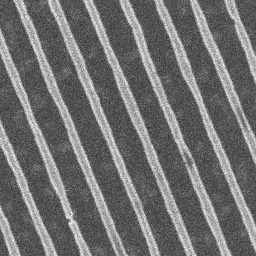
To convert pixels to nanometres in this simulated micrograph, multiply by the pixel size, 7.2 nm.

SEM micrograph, parallel lines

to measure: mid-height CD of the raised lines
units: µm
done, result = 0.0517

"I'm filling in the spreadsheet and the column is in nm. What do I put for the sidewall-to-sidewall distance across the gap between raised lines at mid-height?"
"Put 182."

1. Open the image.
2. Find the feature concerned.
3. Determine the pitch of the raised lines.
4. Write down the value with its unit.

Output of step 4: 0.234 micrometres